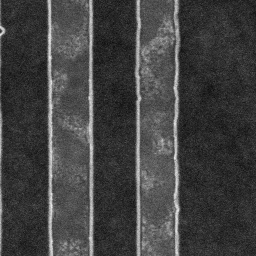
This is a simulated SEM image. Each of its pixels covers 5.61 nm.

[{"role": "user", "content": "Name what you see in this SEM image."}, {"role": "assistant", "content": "one or a few lines or trenches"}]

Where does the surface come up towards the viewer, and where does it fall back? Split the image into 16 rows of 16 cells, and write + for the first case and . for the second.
+++...+++..+++++
+++...+++..+++++
+++...+++..+++++
+++...+++..+++++
+++...+++..+++++
+++...+++..+++++
+++...+++..+++++
+++...+++..+++++
+++...+++..+++++
+++...+++..+++++
+++...+++..+++++
+++...+++..+++++
+++...+++..+++++
+++...+++..+++++
+++...+++..+++++
+++...+++..+++++